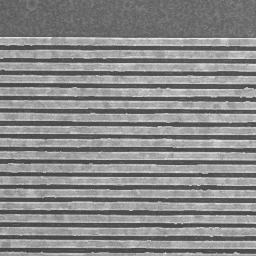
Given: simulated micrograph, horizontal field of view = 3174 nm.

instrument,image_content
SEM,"parallel lines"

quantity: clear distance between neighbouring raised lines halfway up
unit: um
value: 0.0698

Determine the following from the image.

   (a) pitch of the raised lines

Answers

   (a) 157 nm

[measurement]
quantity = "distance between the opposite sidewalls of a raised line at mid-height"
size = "93 nanometres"